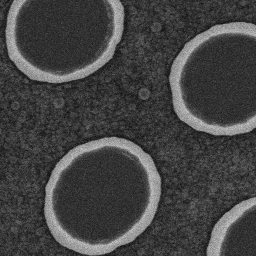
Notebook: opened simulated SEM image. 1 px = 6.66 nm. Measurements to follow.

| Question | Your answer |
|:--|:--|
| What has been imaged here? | raised bodies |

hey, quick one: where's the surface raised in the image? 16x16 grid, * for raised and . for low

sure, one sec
.******.........
.******.........
.******.....****
.******....*****
..***......*****
...........*****
...........*****
............****
................
.....****.......
....*****.......
...*******......
...*******......
...******.....**
....****......**
.....**......***